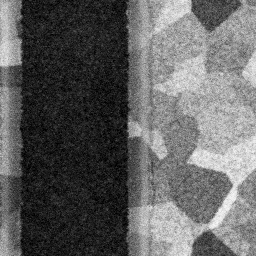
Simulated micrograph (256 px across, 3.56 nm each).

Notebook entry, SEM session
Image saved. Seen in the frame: one or a few lines or trenches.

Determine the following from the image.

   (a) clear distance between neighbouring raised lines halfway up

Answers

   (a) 497 nm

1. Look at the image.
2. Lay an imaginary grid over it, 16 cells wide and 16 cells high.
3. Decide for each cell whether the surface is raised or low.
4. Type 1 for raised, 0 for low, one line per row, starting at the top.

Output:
0000000001111111
0000000001111111
0000000001111111
0000000001111111
0000000001111111
0000000001111111
0000000001111111
0000000001111111
0000000001111111
0000000001111111
0000000001111111
0000000001111111
0000000001111111
0000000001111111
0000000001111111
0000000001111111